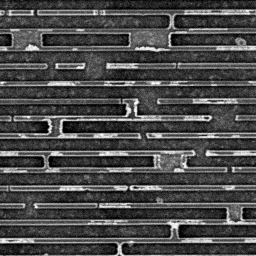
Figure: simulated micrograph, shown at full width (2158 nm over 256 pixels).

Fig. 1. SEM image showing parallel lines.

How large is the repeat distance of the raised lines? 148 nm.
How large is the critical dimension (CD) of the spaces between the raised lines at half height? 112 nm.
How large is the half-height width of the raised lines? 37.9 nanometers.